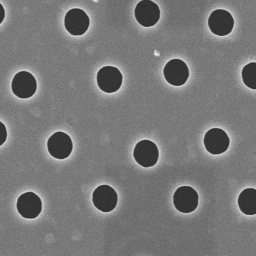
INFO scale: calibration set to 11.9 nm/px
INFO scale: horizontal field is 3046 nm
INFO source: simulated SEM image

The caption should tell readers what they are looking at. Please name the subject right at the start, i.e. a regular array of holes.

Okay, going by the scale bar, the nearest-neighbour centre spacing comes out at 781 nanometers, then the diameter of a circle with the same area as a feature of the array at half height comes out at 0.314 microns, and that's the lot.